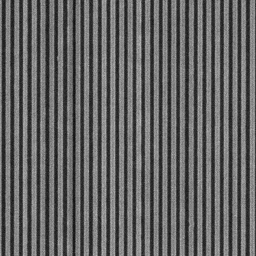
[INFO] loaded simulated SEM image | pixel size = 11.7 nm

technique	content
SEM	parallel lines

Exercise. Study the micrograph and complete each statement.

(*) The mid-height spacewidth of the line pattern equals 51.3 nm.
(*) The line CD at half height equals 49.8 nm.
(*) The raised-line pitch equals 102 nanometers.